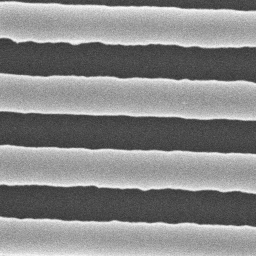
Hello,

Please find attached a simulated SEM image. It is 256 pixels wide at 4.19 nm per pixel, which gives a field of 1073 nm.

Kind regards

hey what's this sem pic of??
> lines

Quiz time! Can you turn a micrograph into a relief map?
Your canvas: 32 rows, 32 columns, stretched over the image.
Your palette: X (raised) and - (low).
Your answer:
XXXX----------------------------
XXXXXXXXXXXXXXXXXXXXXXXXXXXXXXXX
XXXXXXXXXXXXXXXXXXXXXXXXXXXXXXXX
XXXXXXXXXXXXXXXXXXXXXXXXXXXXXXXX
XXXXXXXXXXXXXXXXXXXXXXXXXXXXXXXX
---------X----XXXXX-XXXXXXXXXXXX
--------------------------------
--------------------------------
--------------------------------
XXX-----------------------------
XXXXXXXXXXXXXXXXXXXXXXXXXXXXXXXX
XXXXXXXXXXXXXXXXXXXXXXXXXXXXXXXX
XXXXXXXXXXXXXXXXXXXXXXXXXXXXXXXX
XXXXXXXXXXXXXXXXXXXXXXXXXXXXXXXX
-------------------XXXXXXXXXXXXX
--------------------------------
--------------------------------
--------------------------------
XXXXXXXX------------------------
XXXXXXXXXXXXXXXXXXXXXXXXXXXXXXXX
XXXXXXXXXXXXXXXXXXXXXXXXXXXXXXXX
XXXXXXXXXXXXXXXXXXXXXXXXXXXXXXXX
XXXXXXXXXXXXXXXXXXXXXXXXXXXXXXXX
-----------------XXXX-XXXXXXXXXX
--------------------------------
--------------------------------
--------------------------------
XXXXXXX-------------------------
XXXXXXXXXXXXXXXXXXXXXXXXXXXXXXXX
XXXXXXXXXXXXXXXXXXXXXXXXXXXXXXXX
XXXXXXXXXXXXXXXXXXXXXXXXXXXXXXXX
XXXXXXXXXXXXXXXXXXXXXXXXXXXXXXXX